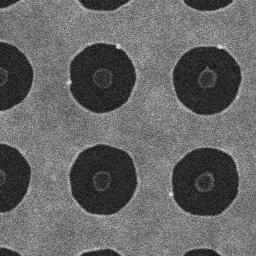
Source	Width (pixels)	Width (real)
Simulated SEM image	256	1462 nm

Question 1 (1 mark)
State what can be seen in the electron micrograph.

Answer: ring-shaped grooves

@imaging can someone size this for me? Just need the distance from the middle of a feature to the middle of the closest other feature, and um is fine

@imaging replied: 0.581